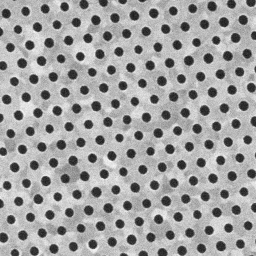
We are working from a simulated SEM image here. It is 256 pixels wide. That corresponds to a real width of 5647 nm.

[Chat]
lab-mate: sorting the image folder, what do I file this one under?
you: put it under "a regular array of holes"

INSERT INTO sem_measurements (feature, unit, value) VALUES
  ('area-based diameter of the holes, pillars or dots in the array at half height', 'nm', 227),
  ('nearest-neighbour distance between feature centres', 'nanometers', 429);